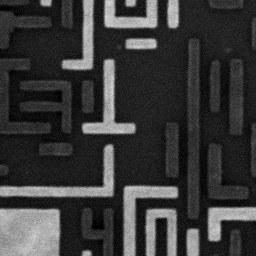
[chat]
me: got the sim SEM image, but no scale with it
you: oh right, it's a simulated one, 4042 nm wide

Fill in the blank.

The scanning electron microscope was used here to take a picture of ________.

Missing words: wiring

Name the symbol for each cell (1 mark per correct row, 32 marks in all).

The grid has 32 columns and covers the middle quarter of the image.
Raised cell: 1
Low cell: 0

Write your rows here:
11111110001100000000000000000001
00000000001100000000000000000001
00000000001100000000000000000001
00000000001100000000000000000001
10000110001100000000000000000001
11000110001100000000000000000001
11000110001100000000000000000001
11000110001100000000000000000001
11000110001100000000000000000001
11000110001100000000000000000001
11000110001100000000000000000001
11000110001100000000000000000001
11000000001100000000000000000001
11000000001100000000000000000001
11000000001100000000000000000001
11000111111111111100000000110001
11000111111111111100000000110001
00000000000000000000000000110001
00000000000000000000000000110001
00000000000000000000000000110001
11000000000100000000000000110001
11000000001100000000000000110001
11000000001100000000000000110001
00000000001100000000000000110001
00000000001100000000000000110001
00000000001100000000000000110001
00000000001100000000000000110001
00000000001100000000000000110001
00000000001100000000000000000001
00000000001100000000000000000001
00000000001100000000000000000001
11111111111100011111111111110001